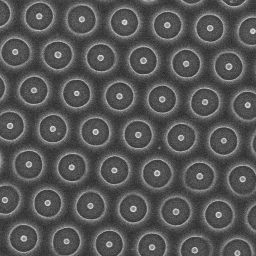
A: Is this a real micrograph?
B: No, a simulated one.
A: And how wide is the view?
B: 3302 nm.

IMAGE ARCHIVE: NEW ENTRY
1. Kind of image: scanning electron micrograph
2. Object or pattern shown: an array of small figures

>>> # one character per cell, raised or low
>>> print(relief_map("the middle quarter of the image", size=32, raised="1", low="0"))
01111100000011111000000111100010
11111110000111111000001111100000
11111111111111111110011111110000
11111111111111111111111111111101
10000111111111111111111111111111
00000011111100001111111100111111
00000011111000000111110000011111
00010001110000000111100000001111
00000011110001000111100010001111
00000011111000000111100000001111
11000111111000001111110000001111
11111111111110011111110000011111
11111111111111111111111111111111
11111110011111111111111111111111
11111000001111111000111111111111
01111000000111110000011111100001
01110000000111100000001111100000
11110000000111100010001111000000
11111000000111100000001111000100
11111000001111110000001111000000
11111111111111111000011111000000
11111111111111111111111111110001
11011111111111111111111111111111
00000111111000111111111111111111
00000111110000001111100001111111
00000011100000001111000000111111
00000111100010001111000000011110
00000111100000001111000100011100
00001111110000001111000000011100
11111111111000011111000000111100
11111111111111111111100001111110
11111111111111111111111111111111